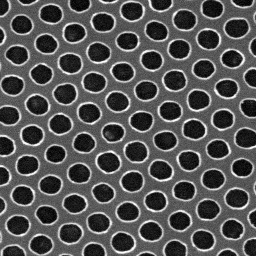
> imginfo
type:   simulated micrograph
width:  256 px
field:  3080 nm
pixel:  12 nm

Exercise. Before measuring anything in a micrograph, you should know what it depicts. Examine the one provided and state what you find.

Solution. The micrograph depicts a regular array of holes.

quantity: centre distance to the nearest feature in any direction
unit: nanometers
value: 362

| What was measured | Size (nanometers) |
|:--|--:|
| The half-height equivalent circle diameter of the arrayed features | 252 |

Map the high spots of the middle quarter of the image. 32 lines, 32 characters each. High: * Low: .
....*********....***....********
....********.....****..*********
******...***......*******.....**
*****.....***....********.....**
*****......********...***......*
..***.....********.....**.....**
...***....********.....****..***
...********....***.....********.
...********.....**....*********.
..********......*********.*****.
****....***.....********.....**.
****.....***...*********.....***
****.....********.....**.....***
.***.....********.....***....***
..***...*********.....*********.
..********....***.....********..
..********.....***...*********..
****..****.....********....***..
***....***.....*******......***.
**......***..****..****.....****
**......********....***.....****
***....********......****.******
*********....**......********...
********......**....*********...
********......***..***...****...
**....***.....********.....**...
*.....****...********......***..
*......*********...**......*****
*.....********......***...******
***..*********......*********..*
********...****.....********....
*******.....***....********.....